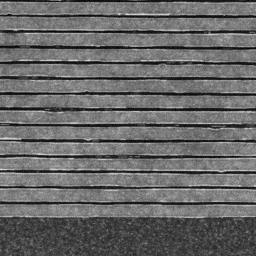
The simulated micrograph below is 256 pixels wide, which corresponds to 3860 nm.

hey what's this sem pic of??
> parallel lines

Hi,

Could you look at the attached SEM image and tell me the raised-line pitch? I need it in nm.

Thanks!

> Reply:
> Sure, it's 235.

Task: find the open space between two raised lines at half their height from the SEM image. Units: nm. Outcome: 54.7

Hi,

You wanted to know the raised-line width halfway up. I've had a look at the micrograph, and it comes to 177 nm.